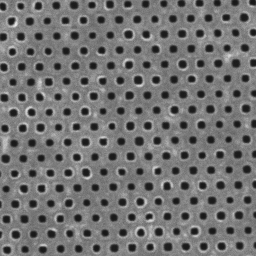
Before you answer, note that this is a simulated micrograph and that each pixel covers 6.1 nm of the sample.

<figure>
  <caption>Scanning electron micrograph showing a regular array of holes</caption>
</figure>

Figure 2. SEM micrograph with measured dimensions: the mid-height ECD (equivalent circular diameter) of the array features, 49.1 nanometers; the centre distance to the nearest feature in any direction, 0.106 µm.